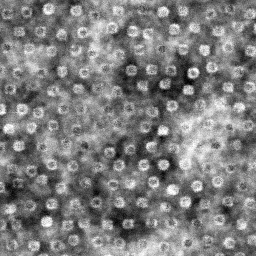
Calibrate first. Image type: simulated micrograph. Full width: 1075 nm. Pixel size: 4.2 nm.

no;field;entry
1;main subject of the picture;a regular array of raised bodies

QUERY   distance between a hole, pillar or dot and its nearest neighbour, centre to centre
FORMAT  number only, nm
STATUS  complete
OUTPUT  78.3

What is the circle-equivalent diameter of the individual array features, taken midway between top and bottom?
39 nanometres